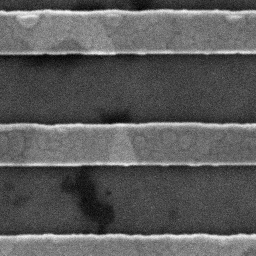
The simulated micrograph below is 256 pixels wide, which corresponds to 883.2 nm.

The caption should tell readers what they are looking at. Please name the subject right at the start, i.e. lines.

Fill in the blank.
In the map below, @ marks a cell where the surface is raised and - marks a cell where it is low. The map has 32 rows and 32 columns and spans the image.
--------------------------------
@@@@@@@@@@-@@@@@@@@@@@@@@@@@@@@@
@@@@@@@@@@@@@@@@@@@@@@@@@@@@@@@@
@@@@@@@@@@@@@@@@@@@@@@@@@@@@@@@@
@@@@@@@@@@@@@@@@@@@@@@@@@@@@@@@@
@@@@@@@@@@@@@@@@@@@@@@@@@@@@@@@@
@@@@@@@@@@@@@@@@@@@@@@@@@@@@@@@@
--------------------------------
--------------------------------
--------------------------------
--------------------------------
--------------------------------
--------------------------------
--------------------------------
--------------------------------
--------------------@@-@@-------
@@@@@@@@@@@@@@@@@@@@@@@@@@@@@@@@
@@@@@@@@@@@@@@@@@@@@@@@@@@@@@@@@
@@@@@@@@@@@@@@@@@@@@@@@@@@@@@@@@
@@@@@@@@@@@@@@@@@@@@@@@@@@@@@@@@
@@@@@@@@@@@@@@@@@@@@@@@@@@@@@@@@
--------------------------------
--------------------------------
--------------------------------
--------------------------------
--------------------------------
--------------------------------
--------------------------------
--------------------------------
-----@@-@@@@-@@@----@@-@@@---@@@
@@@@@@@@@@@@@@@@@@@@@@@@@@@@@@@@
@@@@@@@@@@@@@@@@@@@@@@@@@@@@@@@@